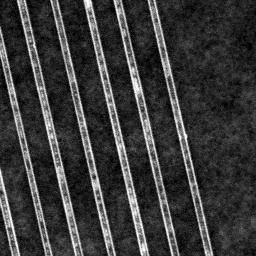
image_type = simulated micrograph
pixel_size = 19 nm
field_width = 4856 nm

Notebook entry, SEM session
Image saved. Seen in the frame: parallel lines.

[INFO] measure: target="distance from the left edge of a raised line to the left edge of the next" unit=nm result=596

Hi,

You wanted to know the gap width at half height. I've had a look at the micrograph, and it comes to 25 pixels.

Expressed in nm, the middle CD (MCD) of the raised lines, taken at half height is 116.